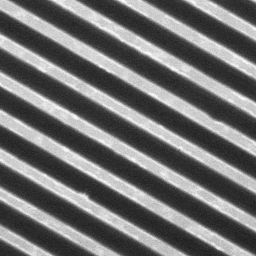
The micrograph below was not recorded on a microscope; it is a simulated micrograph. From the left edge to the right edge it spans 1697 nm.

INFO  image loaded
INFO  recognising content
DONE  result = parallel lines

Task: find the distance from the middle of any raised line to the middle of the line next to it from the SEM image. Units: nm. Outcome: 220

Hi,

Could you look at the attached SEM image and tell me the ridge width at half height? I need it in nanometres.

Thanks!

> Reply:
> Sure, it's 104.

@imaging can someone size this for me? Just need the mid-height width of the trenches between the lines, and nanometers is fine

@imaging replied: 116